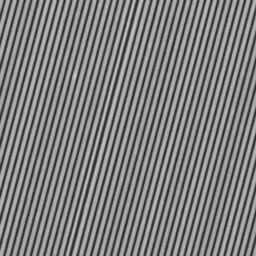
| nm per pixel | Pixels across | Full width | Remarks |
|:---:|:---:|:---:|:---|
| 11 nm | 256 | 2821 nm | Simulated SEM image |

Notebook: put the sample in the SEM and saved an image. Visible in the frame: parallel lines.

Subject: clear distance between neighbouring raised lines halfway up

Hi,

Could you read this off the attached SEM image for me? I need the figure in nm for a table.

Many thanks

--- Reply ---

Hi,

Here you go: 21.3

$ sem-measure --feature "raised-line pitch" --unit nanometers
71.1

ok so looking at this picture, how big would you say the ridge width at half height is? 3.87 pixels